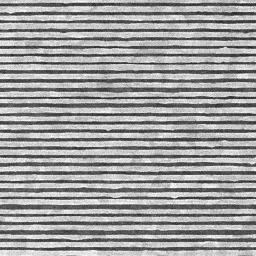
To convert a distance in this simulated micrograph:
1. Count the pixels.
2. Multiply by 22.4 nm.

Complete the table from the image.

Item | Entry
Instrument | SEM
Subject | parallel lines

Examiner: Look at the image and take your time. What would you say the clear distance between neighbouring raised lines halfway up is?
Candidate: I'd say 86.7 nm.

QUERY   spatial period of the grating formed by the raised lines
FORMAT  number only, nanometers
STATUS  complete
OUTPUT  188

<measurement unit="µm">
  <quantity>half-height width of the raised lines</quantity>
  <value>0.103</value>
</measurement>